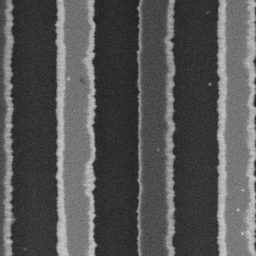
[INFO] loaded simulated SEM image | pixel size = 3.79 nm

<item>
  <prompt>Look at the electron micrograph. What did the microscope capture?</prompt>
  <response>lines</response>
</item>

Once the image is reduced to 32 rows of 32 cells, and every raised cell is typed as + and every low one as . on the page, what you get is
+......+++++.....+++++......++++
+......+++++.....+++++......++++
+......+++++.....++++.......++++
+......+++++.....++++......+++++
+......+++++.....++++.......++++
+......+++++.....++++.......++++
+.......++++.....++++.......++++
+.......++++.....++++.......++++
+......+++++.....+++++......++++
+......+++++.....+++++......++++
+......+++++.....++++.......++++
+......+++++.....++++.......++++
+......+++++.....++++.......++++
+......+++++.....++++.......++++
+......+++++.....++++.......++++
+......+++++.....+++++......++++
+......+++++.....+++++.....+++++
+......+++++.....++++......+++++
+......+++++.....++++.......++++
+......+++++.....++++.......++++
+......+++++.....++++.......++++
+......+++++.....++++.......++++
+......+++++.....++++.......++++
+......+++++.....++++.......++++
+......+++++.....+++++......++++
+......+++++.....+++++......++++
+......+++++.....+++++.....+++++
+.......++++.....++++......+++++
+.......++++.....+++++......++++
+.......++++.....++++.......++++
+.......++++.....++++.......++++
+.......++++.....+++++......++++